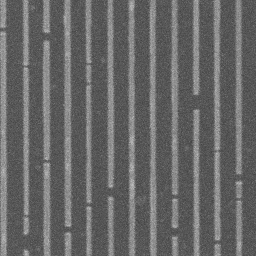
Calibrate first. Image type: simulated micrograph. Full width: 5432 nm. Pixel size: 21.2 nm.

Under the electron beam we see parallel lines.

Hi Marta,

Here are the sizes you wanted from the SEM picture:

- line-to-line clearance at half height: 369 nm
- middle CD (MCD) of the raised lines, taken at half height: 95.5 nm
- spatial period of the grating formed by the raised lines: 0.455 um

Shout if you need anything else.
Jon